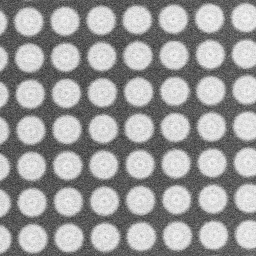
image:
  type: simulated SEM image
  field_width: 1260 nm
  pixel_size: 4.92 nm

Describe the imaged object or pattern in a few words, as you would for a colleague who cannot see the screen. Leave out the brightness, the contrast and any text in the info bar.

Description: an array of small figures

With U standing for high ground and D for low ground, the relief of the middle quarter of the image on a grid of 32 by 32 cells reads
UUUDDDDUUUUUDDDDUUUUUDDDDUUUUUDD
UUDDDDDDDUDDDDDDDDDDDDDDDDDDDDDD
DDDDDDDDDDDDDDDDDDDDDDDDDDDDDDDD
DDDDDDDDDDDDDDDDDDDDDDDDDDDDUDDD
UUUDDDDUUUUUDDDDUUUUUDDDDUUUUUDD
UUUDDDDUUUUUUDDDUUUUUUDDUUUUUUUD
UUUUDDUUUUUUUDDUUUUUUUDDUUUUUUUD
UUUUDDUUUUUUUDDUUUUUUUDDUUUUUUUD
UUUUDDUUUUUUUDDUUUUUUUDDDUUUUUUD
UUUDDDDUUUUUDDDDUUUUUDDDDUUUUUDD
UUDDDDDDDUUDDDDDDDDDDDDDDDDDDDDD
DDDDDDDDDDDDDDDDDDDDDDDDDDDDDDDD
DDDDDDDDDDDDDDDDDDDDDDDDDDDDDDDD
UUUDDDDDUUUUDDDDUUUUUDDDDUUUUUDD
UUUUDDDUUUUUUDDDUUUUUUDDDUUUUUUD
UUUUDDUUUUUUUDDUUUUUUUDDUUUUUUUD
UUUUDDUUUUUUUDDUUUUUUUDDUUUUUUUD
UUUUDDDUUUUUUDDDUUUUUUDDDUUUUUUD
UUUDDDDUUUUUDDDDUUUUUDDDDDUUUUDD
UUDDDDDDDUUDDDDDDDDDDDDDDDDDDDDD
DDDDDDDDDDDDDDDDDDDDDDDDDDDDDDDD
DDDDDDDDDDDDDDDDDDDDDDDDDDDDDDDD
UUUDDDDDUUUUDDDDDUUUUDDDDDUUUUUD
UUUUDDDUUUUUUDDDUUUUUUDDDUUUUUUD
UUUUDDDUUUUUUDDDUUUUUUDDDUUUUUUD
UUUUDDDUUUUUUDDDUUUUUUDDDUUUUUUD
UUUUDDDUUUUUUDDDUUUUUUDDDUUUUUUD
UUUUDDDUUUUUUDDDUUUUUDDDDDUUUUDD
UUDDDDDDDUUDDDDDDDUUDDDDDDDDDDDD
DDDDDDDDDDDDDDDDDDDDDDDDDDDDDDDD
DDDDDDDDDDDDDDDDDDDDDDDDDDDDDDDD
UUUDDDDDUUUUDDDDDUUUUDDDDDUUUUUD